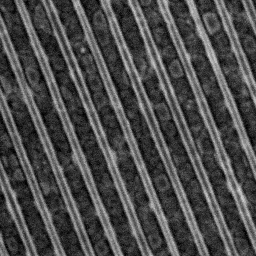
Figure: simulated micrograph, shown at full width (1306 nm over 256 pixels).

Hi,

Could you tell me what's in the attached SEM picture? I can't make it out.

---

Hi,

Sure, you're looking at parallel lines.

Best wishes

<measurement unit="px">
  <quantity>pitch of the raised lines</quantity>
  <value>26.5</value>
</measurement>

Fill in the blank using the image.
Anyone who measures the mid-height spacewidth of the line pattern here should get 94.8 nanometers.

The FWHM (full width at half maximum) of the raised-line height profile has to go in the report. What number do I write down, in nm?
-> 42.7